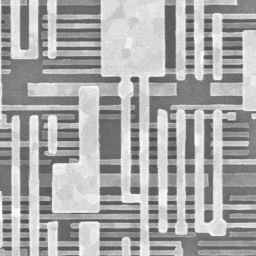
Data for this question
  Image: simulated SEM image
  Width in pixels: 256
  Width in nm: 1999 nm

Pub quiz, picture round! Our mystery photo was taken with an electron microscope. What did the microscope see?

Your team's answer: wiring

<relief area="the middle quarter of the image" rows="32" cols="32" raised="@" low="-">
---------@@@@@@@@@@@@@@@@---@@--
---------@@@@@@@@@@@@@@@@---@@--
---------@@@@@@@@@@@@@@@@---@@--
--------------@@@--@@-------@@--
--------------@@@--@@-----------
--------------@@@--@@-----------
----@@@@------@@@--@@-----------
----@@@@------@@@--@@-----------
----@@@@@-----@@@--@@-----------
----@@@@@-----@@---@@-----------
----@@@@@-----@@---@@-----------
----@@@@@-----@@---@@---@-------
----@@@@------@@---@@---@@--@@--
----@@@@------@@---@@---@@--@@--
----@@@@------@@---@@---@@--@@--
----@@@@------@@---@@---@@--@@--
----@@@@------@@---@@---@@--@@--
----@@@@------@@---@@---@@--@@--
----@@@@------@@---@@---@@--@@--
----@@@@------@@---@@---@@--@@--
----@@@@------@@@--@@---@@--@@--
----@@@@@-----@@@--@@---@@--@@--
----@@@@@-----@@@--@@---@@--@@--
----@@@@@-----@@@--@@---@@--@@--
----@@@@@-----@@@--@@---@@--@@--
@@@@@@@@@-----@@@--@@---@@--@@--
@@@@@@@@@-----@@@--@@---@@--@@--
@@@@@@@@@-----@@@--@@---@@--@@--
@@@@@@@@@-----@@---@@---@@--@@--
@@@@@@@@@-----@@---@@---@@--@@--
@@@@@@@@@-----@@---@@---@@--@@--
@@@@@@@@@-----@@---@@---@@--@@--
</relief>